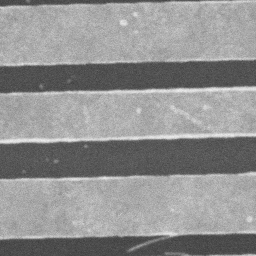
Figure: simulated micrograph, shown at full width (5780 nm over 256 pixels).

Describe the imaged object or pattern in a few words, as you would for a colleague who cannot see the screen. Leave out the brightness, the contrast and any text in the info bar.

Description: lines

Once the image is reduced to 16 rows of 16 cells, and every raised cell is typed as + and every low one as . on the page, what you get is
++++++++++++++++
++++++++++++++++
++++++++++++++++
++++++++++++++++
................
................
++++++++++++++++
++++++++++++++++
+++++++++++++...
................
................
++++++++++++++++
++++++++++++++++
++++++++++++++++
++++++++++++++++
................